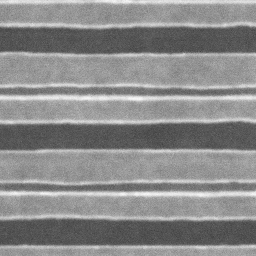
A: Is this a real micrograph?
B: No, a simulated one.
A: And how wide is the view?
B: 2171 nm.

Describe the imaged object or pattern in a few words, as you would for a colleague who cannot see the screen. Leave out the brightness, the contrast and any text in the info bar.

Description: lines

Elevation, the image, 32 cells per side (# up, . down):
################################
################################
################################
................................
................................
................................
................................
################################
################################
################################
################################
################################
################################
################################
################################
................................
................................
................................
................................
################################
################################
################################
################################
################################
################################
################################
################################
................................
................................
................................
................................
################################